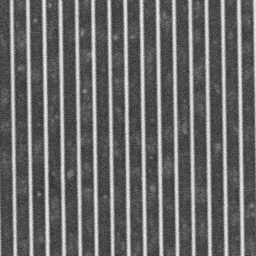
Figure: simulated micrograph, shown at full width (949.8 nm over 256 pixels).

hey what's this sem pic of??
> parallel lines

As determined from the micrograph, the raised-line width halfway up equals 10.7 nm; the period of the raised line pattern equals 60.2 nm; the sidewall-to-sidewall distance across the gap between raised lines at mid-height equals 49.6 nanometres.